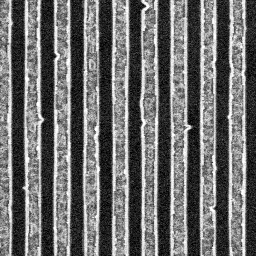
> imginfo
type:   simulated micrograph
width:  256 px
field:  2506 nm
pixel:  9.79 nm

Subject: parallel lines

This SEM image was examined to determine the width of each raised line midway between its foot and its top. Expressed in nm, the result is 138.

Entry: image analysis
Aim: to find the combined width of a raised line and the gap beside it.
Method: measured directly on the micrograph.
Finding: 286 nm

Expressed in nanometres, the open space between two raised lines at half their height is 147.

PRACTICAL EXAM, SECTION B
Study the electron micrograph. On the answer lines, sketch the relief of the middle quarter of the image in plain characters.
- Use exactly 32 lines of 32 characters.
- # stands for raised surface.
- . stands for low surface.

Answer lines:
#....####...####....###....###..
#....####...####....###....###..
#....####...####....###....###..
#....####...####....###....###..
#....####...####....###....###..
#....####...####....###....###..
#....####...####....###....###..
#....####...####....###....###..
#....####...####...####....###..
#....####...####...####....###..
#....####...####...####....###..
#....####....###...####....###..
#....####....###....###....###..
#....####....###....###....###..
#....####....###....###....####.
#....####....###....###....####.
#....####....###....###....####.
#....###.....###....###....####.
#....###.....###....###....####.
#....###.....###....###....####.
#....####....###....###....####.
#....####....###....###....###..
#....####....###....###....###..
#....####....###....###....###..
#....####....###....###....###..
#....####....###....###....###..
#....####...####....###....###..
#....####...####....###....###..
#....####...####....###....###..
#....####...####....###....###..
#....####...####....###....###..
#....####....###....###....###..